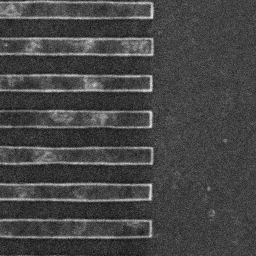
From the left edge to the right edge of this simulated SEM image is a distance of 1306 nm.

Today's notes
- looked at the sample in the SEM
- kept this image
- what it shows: parallel lines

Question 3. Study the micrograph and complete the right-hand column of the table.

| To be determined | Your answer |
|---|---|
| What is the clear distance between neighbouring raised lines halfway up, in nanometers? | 102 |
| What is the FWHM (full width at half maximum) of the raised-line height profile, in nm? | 82.2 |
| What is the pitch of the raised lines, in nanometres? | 186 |